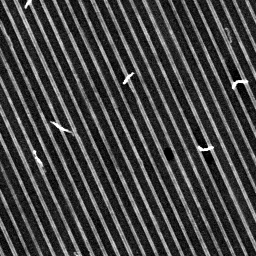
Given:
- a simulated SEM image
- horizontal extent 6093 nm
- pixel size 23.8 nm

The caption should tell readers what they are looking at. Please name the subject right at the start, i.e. parallel lines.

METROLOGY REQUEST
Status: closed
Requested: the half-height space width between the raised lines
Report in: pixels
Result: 8.88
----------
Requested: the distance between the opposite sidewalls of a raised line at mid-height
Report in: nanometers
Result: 62.3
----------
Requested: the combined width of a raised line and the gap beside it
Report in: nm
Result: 278